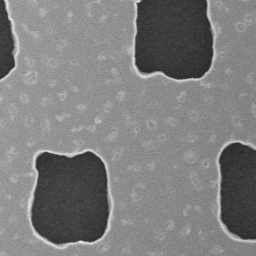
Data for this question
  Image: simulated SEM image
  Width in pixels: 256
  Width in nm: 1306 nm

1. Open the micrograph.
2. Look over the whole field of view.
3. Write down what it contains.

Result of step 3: holes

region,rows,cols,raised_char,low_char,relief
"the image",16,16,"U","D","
UUUUUUUUUDDDDUUU
DUUUUUUUUDDDDUUU
DUUUUUUUDDDDDUUU
DUUUUUUUDDDDDUUU
DUUUUUUUUDDDDUUU
UUUUUUUUUUUUUUUU
UUUUUUUUUUUUUUUU
UUUUUUUUUUUUUUUU
UUUUUUUUUUUUUUUU
UUUUUUUUUUUUUUDD
UUDDDDDUUUUUUUDD
UUDDDDDUUUUUUUDD
UUDDDDDUUUUUUUDD
UUDDDDDUUUUUUUDD
UUDDDDDUUUUUUUDD
UUUUUUUUUUUUUUUU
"